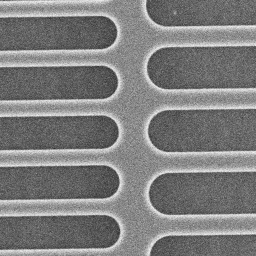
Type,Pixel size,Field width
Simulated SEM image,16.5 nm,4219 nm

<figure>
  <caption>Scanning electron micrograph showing groups of lines, slits or small figures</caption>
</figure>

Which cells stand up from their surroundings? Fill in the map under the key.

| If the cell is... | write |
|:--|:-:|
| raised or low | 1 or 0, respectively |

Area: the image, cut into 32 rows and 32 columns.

11111111111111111100000000000000
11111111111111111100000000000000
00000000000000111110000000000000
00000000000000011111111111111111
00000000000000011111111111111111
00000000000000111111111111111111
11111111111111111110000000000000
11111111111111111110000000000000
00000000000000111100000000000000
00000000000000011110000000000000
00000000000000011110000000000000
00000000000000111111111111111111
00000001111111111111111111111111
11111111111111111111111111111100
10000000000001111110000000000000
00000000000000011110000000000000
00000000000000011110000000000000
00000000000000011110000000000000
00000000000001111111000000000000
11111111111111111111111111111111
11111111111111111111111111111111
00000000000000011111111100000000
00000000000000011110000000000000
00000000000000011110000000000000
00000000000000111110000000000000
11111111111111111110000000000000
11111111111111111111000000000000
00000000000000011111111111111111
00000000000000011111111111111111
00000000000000011111100000000000
00000000000000111110000000000000
11111111111111111110000000000000